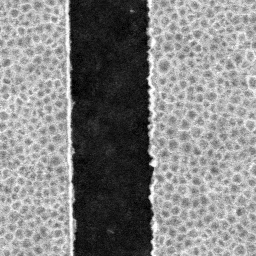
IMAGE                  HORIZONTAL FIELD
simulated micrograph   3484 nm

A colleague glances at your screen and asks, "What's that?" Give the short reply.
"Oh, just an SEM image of one or a few lines or trenches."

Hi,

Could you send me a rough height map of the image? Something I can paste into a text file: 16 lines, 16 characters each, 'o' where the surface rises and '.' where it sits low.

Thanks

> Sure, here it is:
oooo.....ooooooo
oooo.....ooooooo
oooo......oooooo
oooo.....ooooooo
oooo.....ooooooo
oooo.....ooooooo
oooo......oooooo
oooo......oooooo
oooo.....ooooooo
oooo......oooooo
oooo......oooooo
oooo......oooooo
oooo......oooooo
oooo......oooooo
oooo......oooooo
oooo......oooooo